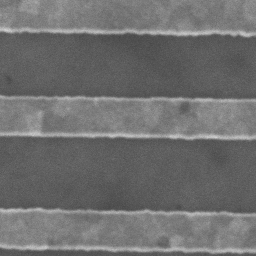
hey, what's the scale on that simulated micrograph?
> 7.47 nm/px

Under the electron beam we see lines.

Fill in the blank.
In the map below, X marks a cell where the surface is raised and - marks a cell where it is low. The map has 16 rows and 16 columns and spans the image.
XXXXXXXXXXXXXXXX
XXXXXXXXXXXXXXXX
----------------
----------------
----------------
----------------
XXXXXXXXXXXXXXXX
XXXXXXXXXXXXXXXX
--XXXXXXXXXXXXXX
----------------
----------------
----------------
----------------
XXXXXXXXXXXXXXXX
XXXXXXXXXXXXXXXX
XXXXXXXXXXXXXXXX